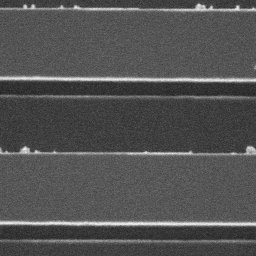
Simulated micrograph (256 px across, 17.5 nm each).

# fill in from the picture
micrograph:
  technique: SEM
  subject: lines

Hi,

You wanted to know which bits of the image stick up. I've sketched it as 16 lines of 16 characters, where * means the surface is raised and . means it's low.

................
****************
****************
****************
****************
................
................
................
................
................
****************
****************
****************
****************
................
................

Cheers